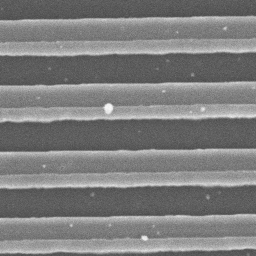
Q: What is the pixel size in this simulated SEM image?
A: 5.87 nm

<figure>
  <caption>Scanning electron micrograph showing lines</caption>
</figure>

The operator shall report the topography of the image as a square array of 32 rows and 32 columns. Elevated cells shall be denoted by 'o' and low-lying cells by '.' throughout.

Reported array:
................................
................................
..oooooooooooooooooooooooooooooo
oooooooooooooooooooooooooooooooo
oooooooooooooooooooooooooooooooo
oooooooooooooooooooooooooooooooo
ooooooooooooooooooooo...o.......
................................
................................
................................
....................oooooooooooo
oooooooooooooooooooooooooooooooo
oooooooooooooooooooooooooooooooo
oooooooooooooooooooooooooooooooo
oooooooooooooooooooooooooooooooo
................................
................................
................................
................................
oooooooooooooooooooooooooooooooo
oooooooooooooooooooooooooooooooo
oooooooooooooooooooooooooooooooo
oooooooooooooooooooooooooooooooo
................................
................................
................................
................................
oooooooooooooooooooooooooooooooo
oooooooooooooooooooooooooooooooo
oooooooooooooooooooooooooooooooo
oooooooooooooooooooooooooooooooo
ooooooo.....o...................